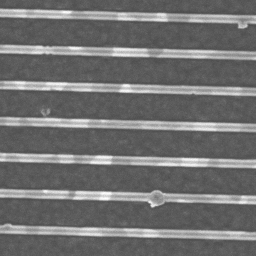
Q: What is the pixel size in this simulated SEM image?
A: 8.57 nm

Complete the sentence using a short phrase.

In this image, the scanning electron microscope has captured parallel lines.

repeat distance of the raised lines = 309 nm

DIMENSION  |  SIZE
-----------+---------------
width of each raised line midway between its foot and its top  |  52.4 nm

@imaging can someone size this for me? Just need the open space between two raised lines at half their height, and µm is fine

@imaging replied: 0.255